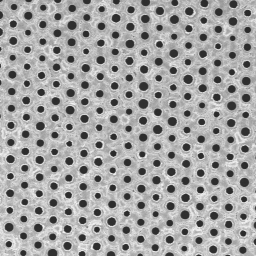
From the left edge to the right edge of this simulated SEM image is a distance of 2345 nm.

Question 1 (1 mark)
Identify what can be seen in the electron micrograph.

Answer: a regular array of holes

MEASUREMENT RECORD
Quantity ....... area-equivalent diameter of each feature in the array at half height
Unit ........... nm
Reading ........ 66.2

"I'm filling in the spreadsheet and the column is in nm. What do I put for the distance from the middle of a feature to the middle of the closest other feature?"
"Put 152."